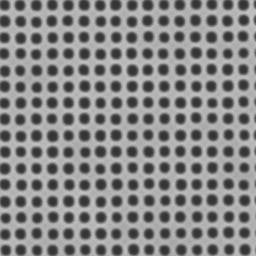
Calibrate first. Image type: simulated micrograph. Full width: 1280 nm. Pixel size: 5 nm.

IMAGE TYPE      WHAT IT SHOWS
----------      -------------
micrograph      a regular array of holes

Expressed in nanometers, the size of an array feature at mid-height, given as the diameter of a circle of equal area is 53.8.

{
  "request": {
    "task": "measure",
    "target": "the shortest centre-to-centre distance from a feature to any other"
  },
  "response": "77.8 nm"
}